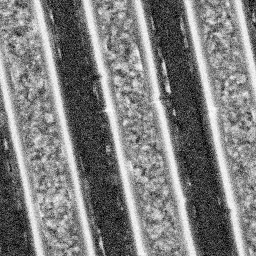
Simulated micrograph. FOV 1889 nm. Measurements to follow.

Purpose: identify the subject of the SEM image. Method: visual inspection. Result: one or a few lines or trenches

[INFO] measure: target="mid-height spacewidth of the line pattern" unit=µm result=0.35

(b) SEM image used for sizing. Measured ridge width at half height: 378 nanometers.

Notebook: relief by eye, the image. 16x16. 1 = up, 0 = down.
1100011110001110
1110001110001110
1110001110001110
1110001110001111
1110001111000111
1111000111000111
1111000111000111
0111000111000111
0111000111000011
0111000111100011
0111100011100011
0011100011100011
0011100011100011
0011100011110001
0011100001110001
0011110001110001